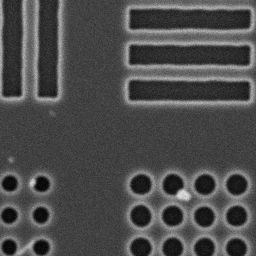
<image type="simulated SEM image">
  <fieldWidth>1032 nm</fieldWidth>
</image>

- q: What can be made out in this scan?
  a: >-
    groups of lines, slits or small figures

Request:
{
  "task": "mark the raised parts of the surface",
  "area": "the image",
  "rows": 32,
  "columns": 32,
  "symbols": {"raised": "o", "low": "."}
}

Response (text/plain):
...oo...oooooooooooooooooooooooo
...oo..ooooooooo...............o
...oo..ooooooooo...............o
...oo..ooooooooo...............o
...oo..ooooooooooooooooooooooooo
...oo..ooooooooooooooooooooooooo
...oo..ooooooooo...............o
...oo..ooooooooo...............o
...oo..ooooooooooooooooooooooooo
...oo..ooooooooooooooooooooooooo
...oo..ooooooooo...............o
...oo..ooooooooo...............o
oooooooooooooooo...............o
oooooooooooooooooooooooooooooooo
oooooooooooooooooooooooooooooooo
oooooooooooooooooooooooooooooooo
oooooooooooooooooooooooooooooooo
oooooooooooooooooooooooooooooooo
oooooooooooooooooooooooooooooooo
oooooooooooooooooooooooooooooooo
oooooooooooooooooooooooooooooooo
oooooooooooooooooooooooooooooooo
..oo..oooooooooo...o...o...o...o
..oo..oooooooooo...o...o...o...o
oooooooooooooooooooooooooooooooo
oooooooooooooooooooooooooooooooo
..oo..oooooooooo...o...o...o...o
..oo..oooooooooo...o...o...o...o
oooooooooooooooooooooooooooooooo
oooooooooooooooooooooooooooooooo
..oo..oooooooooo...o...o...o...o
..oo..oooooooooo...o...o...o...o